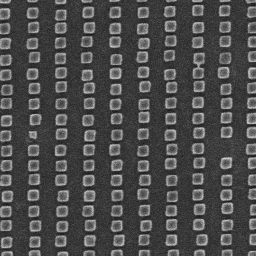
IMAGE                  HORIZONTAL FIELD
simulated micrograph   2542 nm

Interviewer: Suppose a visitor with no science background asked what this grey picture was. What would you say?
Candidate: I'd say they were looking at a regular array of raised bodies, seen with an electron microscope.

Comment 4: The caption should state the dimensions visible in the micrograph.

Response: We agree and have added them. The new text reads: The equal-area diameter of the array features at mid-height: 0.115 micrometres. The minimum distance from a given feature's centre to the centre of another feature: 0.144 micrometres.